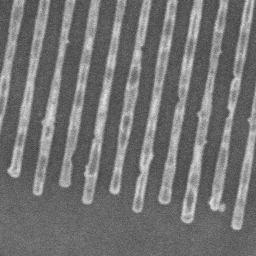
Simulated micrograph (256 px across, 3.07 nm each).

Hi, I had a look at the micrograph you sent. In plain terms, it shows parallel lines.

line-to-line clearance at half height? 51.8 nanometers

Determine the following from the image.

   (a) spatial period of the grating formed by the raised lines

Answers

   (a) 77.6 nanometres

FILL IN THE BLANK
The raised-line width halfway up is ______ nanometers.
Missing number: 27.2